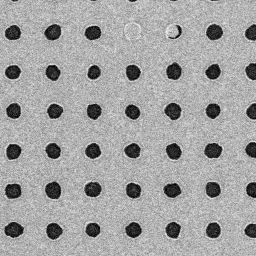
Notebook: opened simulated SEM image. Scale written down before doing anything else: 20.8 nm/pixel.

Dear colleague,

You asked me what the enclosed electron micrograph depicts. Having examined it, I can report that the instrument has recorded a regular array of holes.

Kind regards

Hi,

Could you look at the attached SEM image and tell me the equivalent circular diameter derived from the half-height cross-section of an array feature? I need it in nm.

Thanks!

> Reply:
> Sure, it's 340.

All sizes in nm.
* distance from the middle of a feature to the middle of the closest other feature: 811